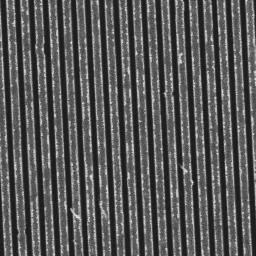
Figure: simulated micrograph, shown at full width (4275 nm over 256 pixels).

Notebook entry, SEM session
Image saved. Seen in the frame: parallel lines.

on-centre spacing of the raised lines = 235 nm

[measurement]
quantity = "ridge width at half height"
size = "150 nanometres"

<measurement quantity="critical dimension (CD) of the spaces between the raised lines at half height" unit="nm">89.6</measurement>